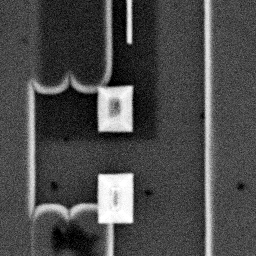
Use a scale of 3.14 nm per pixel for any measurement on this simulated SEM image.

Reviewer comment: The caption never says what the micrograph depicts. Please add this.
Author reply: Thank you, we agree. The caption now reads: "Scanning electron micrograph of wiring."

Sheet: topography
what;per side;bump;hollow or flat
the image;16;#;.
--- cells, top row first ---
#######......###
#######......###
#######......###
#######......###
#######......###
####.###.....###
##....##.....###
##....##.....###
##...........###
##...........###
##...........###
##....##.....###
##....##.....###
########.....###
#######......###
#######......###